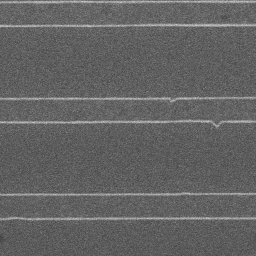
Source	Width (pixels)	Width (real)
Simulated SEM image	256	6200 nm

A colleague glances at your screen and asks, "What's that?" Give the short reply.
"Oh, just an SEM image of one or a few lines or trenches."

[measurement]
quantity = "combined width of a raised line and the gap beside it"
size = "2340 nanometers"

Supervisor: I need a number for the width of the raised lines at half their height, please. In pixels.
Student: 23.8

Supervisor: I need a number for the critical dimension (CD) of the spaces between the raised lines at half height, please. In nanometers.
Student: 1750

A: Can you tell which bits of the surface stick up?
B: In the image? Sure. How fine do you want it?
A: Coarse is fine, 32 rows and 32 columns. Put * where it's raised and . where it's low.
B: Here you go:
********************************
********************************
********************************
................................
................................
................................
................................
................................
................................
................................
................................
................................
********************************
********************************
********************************
...........................*....
................................
................................
................................
................................
................................
................................
................................
................................
********************************
********************************
********************************
................................
................................
................................
................................
................................